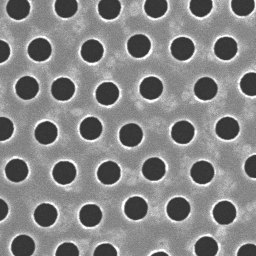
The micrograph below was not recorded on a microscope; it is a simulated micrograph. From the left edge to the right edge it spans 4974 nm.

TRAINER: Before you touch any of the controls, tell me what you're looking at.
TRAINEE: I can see a regular array of holes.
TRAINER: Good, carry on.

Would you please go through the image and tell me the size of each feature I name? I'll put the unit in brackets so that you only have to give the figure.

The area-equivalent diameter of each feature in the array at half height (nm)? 472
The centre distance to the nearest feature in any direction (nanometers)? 849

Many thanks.